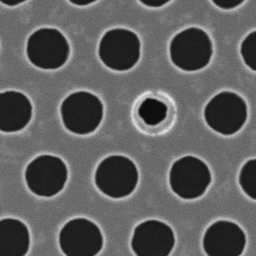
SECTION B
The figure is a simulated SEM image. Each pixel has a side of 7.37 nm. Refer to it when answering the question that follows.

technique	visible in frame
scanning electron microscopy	a regular array of holes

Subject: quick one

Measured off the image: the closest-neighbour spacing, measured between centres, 529 nm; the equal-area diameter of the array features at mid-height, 42.2 pixels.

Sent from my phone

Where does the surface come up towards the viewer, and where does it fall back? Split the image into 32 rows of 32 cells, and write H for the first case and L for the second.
HLHHHHHHHLLHHHHHHHLLLHHHHHHLLLHH
HHHHHHHHHHHHHHHHHHHHHHHHHHHHHHHH
HHHHHHHHHHHHHHHHHHHHHHHHHHHHHHHH
HHHHHHHHHHHHHHHHHHHHHHHHHHHHHHHH
HHHHLLLLHHHHHLLLLHHHHHLLLLHHHHHL
HHHLLLLLLHHHLLLLLLHHHLLLLLHHHHLL
HHHLLLLLLHHHLLLLLLHHHLLLLLHHHHLL
HHHHLLLLHHHHHLLLLHHHHLLLLLHHHHLL
HHHHHLLHHHHHHHLLHHHHHHHLLHHHHHHL
HHHHHHHHHHHHHHHHHHHHHHHHHHHHHHHH
HHHHHHHHHHHHHHHHHHHHHHHHHHHHHHHH
LLHHHHHHHHHHHHHHHHHHHHHHHHHHLHHH
LLLLHHHHLLLLHHHHHHLLHHHHHHLLLLHH
LLLLHHHHLLLLLHHHHLLLLHHHHHLLLLLH
LLLLHHHHLLLLLHHHHHLLLHHHHHLLLLLH
LLLHHHHHLLLLHHHHHHLLHHHHHHLLLLHH
HHHHHHHHHLLHHHHHHHHHHHHHHHHLLHHH
HHHHHHHHHHHHHHHHHHHHHHHHHHHHHHHH
HHHHHHHHHHHHHHHHHHHHHHHHHHHHHHHH
HHHHHLLHHHHHHHLHHHHHHHHLHHHHHHHH
HHHHLLLLHHHHHLLLLHHHHHLLLLHHHHHL
HHHLLLLLHHHHLLLLLHHHHLLLLLHHHHLL
HHHLLLLLHHHHLLLLLHHHHLLLLLHHHHLL
HHHHLLLLHHHHLLLLLHHHHLLLLLHHHHLL
HHHHHLHHHHHHHHLLHHHHHHLLLHHHHHHL
HHHHHHHHHHHHHHHHHHHHHHHHHHHHHHHH
HHHHHHHHHHHHHHHHHHHHHHHHHHHHHHHH
LLHHHHHHHLLHHHHHHHHHHHHHHHHHHHHH
LLLHHHHHLLLLHHHHHLLLLHHHHHLLLLHH
LLLLHHHLLLLLLHHHHLLLLLHHHLLLLLLH
LLLLHHHLLLLLLHHHLLLLLLHHHLLLLLLH
LLLHHHHHLLLLHHHHHLLLLHHHHHLLLLHH